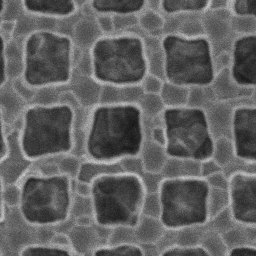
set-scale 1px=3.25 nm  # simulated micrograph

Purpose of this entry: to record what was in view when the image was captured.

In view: a regular array of holes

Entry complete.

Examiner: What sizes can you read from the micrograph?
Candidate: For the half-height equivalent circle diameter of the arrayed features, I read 168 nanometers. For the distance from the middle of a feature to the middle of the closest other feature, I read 222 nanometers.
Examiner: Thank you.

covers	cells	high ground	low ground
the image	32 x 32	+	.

+++......+++......++......+++...
+++++....+++++...++++.++++++++..
++++++++++++++++++++++++++++++++
++++++++++++++++++++++++++++++++
++++...++++++++++++++.+++++++++.
+++......+++......++......+++...
+++......+++......+++.....+++...
.++......+++......+++.....+++...
.++......+++......+++......++...
.++......+++......+++......++...
++++..++++++++..++++++....++++..
++++++++++++++++++++++++++++++++
++++++++++++++++++++++++++++++++
++++.....+++.....+++++.+++++++.+
+++......+++.....++++.....+++...
+++......++.......+++.....+++...
+++......++.......+++.....+++...
+++......++.......+++.....+++...
.++......++......++++......++...
++++.++++++....+++++++....++++..
++++++++++++++++++++++++++++++++
++++++++++++++++++++++++++++++++
+++.....++++.....++++.+..++++...
+++.....++++......++......+++...
+++......+++......++......+++...
+++......+++......++......+++...
+++.....++++.....+++......+++...
+++.....++++.....+++......++++..
++++++++++++++++++++++++++++++++
++++++++++++++++++++++++++++++++
++++++++++++++++++++++++++++++++
+++.....++++......+++.....+++...